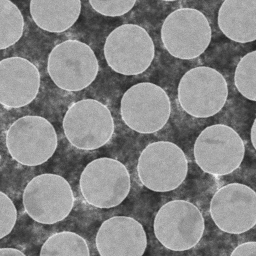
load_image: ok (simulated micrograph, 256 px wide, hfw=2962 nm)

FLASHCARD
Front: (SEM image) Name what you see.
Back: a regular array of raised bodies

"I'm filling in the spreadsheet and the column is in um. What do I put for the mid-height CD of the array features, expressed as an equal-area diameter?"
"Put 0.581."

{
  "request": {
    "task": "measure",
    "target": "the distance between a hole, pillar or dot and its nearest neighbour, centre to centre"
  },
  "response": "0.682 microns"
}